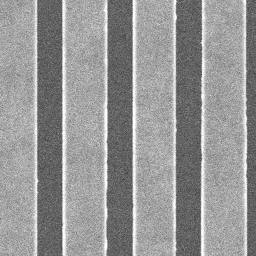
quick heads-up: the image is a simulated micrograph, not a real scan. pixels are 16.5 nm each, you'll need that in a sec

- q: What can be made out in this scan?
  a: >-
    lines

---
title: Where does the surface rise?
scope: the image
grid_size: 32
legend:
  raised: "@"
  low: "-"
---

@@@@@---@@@@@----@@@@@---@@@@@@-
@@@@@---@@@@@----@@@@@---@@@@@@-
@@@@@---@@@@@----@@@@@---@@@@@@-
@@@@@---@@@@@----@@@@@---@@@@@@-
@@@@@---@@@@@----@@@@@---@@@@@@-
@@@@@---@@@@@----@@@@@---@@@@@@-
@@@@@---@@@@@----@@@@@---@@@@@@-
@@@@@---@@@@@----@@@@@---@@@@@@-
@@@@@---@@@@@----@@@@@---@@@@@@-
@@@@@---@@@@@----@@@@@---@@@@@@-
@@@@@---@@@@@----@@@@@---@@@@@@-
@@@@@---@@@@@----@@@@@---@@@@@@-
@@@@@---@@@@@----@@@@@---@@@@@@-
@@@@@---@@@@@----@@@@@---@@@@@@-
@@@@@---@@@@@----@@@@@---@@@@@@-
@@@@@---@@@@@----@@@@@---@@@@@@-
@@@@@---@@@@@----@@@@@---@@@@@@-
@@@@@---@@@@@----@@@@@---@@@@@@-
@@@@@---@@@@@----@@@@@---@@@@@@-
@@@@@---@@@@@----@@@@@---@@@@@@-
@@@@@---@@@@@----@@@@@---@@@@@@-
@@@@@---@@@@@----@@@@@---@@@@@@-
@@@@@---@@@@@----@@@@@---@@@@@@-
@@@@@---@@@@@----@@@@@---@@@@@@-
@@@@@---@@@@@----@@@@@---@@@@@@-
@@@@@---@@@@@----@@@@@---@@@@@@-
@@@@@---@@@@@----@@@@@---@@@@@@-
@@@@@---@@@@@----@@@@@---@@@@@@-
@@@@@---@@@@@----@@@@@---@@@@@@-
@@@@@---@@@@@----@@@@@---@@@@@@-
@@@@@---@@@@@----@@@@@---@@@@@@-
@@@@@---@@@@@----@@@@@---@@@@@@-